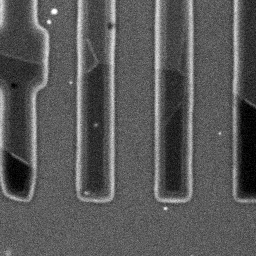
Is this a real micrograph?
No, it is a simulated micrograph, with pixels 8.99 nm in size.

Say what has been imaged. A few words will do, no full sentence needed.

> wiring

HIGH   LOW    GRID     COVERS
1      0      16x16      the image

1100011000110001
1100011000110001
1110011000110001
1110011000110001
1110011000110001
1100011000110001
1100011000110001
1100011000110001
1100011000110001
1100011000110001
1100011000110001
1100011000110001
0000000000000000
0000000000000000
0000000000000000
0000000000000000